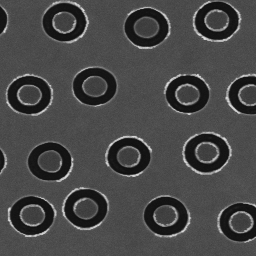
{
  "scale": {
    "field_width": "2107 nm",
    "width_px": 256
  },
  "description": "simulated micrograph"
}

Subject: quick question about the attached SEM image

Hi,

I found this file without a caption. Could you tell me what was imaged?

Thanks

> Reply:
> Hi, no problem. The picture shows a regular array of ring-shaped grooves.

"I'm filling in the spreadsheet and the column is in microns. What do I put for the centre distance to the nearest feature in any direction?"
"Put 0.546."